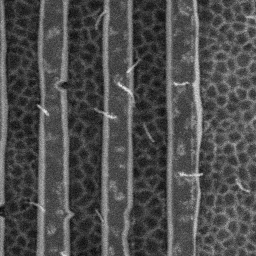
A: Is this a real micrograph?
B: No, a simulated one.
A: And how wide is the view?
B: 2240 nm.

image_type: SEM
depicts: one or a few lines or trenches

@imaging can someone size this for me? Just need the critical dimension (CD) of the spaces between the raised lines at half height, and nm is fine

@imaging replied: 332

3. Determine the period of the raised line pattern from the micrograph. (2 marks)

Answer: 569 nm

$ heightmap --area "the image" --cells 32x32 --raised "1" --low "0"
00000111000001110000011110000000
00000111000001110000011110000000
00000111000001110000011110000000
00000111000001110000011110000000
00000111000001110000011110000000
10000111000001110000011110000000
00000111000001110000011110000000
00000111000001110000011110000000
00000111000001111000011110000000
00000111000001110000011110000000
00000110000001110000011110000000
00000111000001111000011110000000
10000111000001111000011110000000
10000111000001110000011110000000
10000111000001110000011110000000
10000111000001110000011110000000
10000111000001110000011110000000
10000111000001110000011110000000
00000111000001110000011110000000
00000111000001110000011110000000
00000111000001110000011110000000
00000111000001110000011110000000
00000111000001110000011110000000
00000111000001110000011110000000
00000111000001110000011110000000
00000111100001110000011110000000
00000111100001110000011110000000
00000111000001110000011110000000
00000111000001110000011110000000
00000111000001110000011100000000
00000111000001110000011100000000
00000111000001110000011100000000